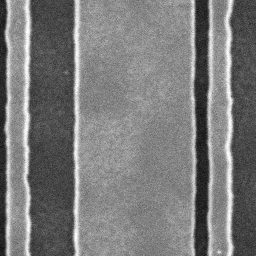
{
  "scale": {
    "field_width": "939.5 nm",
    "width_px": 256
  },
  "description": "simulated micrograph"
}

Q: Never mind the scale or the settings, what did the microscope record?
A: lines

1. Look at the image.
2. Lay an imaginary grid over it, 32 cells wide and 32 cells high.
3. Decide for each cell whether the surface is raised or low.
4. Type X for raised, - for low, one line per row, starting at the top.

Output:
-XX-------XXXXXXXXXXXXXX--XXX---
-XX-------XXXXXXXXXXXXXX--XXX---
-XX-------XXXXXXXXXXXXXX--XX----
-XX-------XXXXXXXXXXXXXX--XXX---
-XX-------XXXXXXXXXXXXXXX-XXX---
-XX-------XXXXXXXXXXXXXX--XXX---
-XX-------XXXXXXXXXXXXXX--XXX---
-XX-------XXXXXXXXXXXXXX--XXX---
-XX-------XXXXXXXXXXXXXX--XXX---
-XX-------XXXXXXXXXXXXXX--XXX---
-XX-------XXXXXXXXXXXXXX--XXX---
-XX-------XXXXXXXXXXXXXX--XXX---
-XX-------XXXXXXXXXXXXXX--XXX---
-XX-------XXXXXXXXXXXXXX--XXX---
-XX-------XXXXXXXXXXXXXX--XXX---
-XX-------XXXXXXXXXXXXXX--XXX---
-XX------XXXXXXXXXXXXXXX--XXX---
-XX-------XXXXXXXXXXXXXX--XXX---
-XX------XXXXXXXXXXXXXXX--XX----
-XX------XXXXXXXXXXXXXXXX-XXX---
-XX-------XXXXXXXXXXXXXXX-XXX---
-XX-------XXXXXXXXXXXXXX--XXX---
-XX-------XXXXXXXXXXXXXX--XXX---
-XX-------XXXXXXXXXXXXXX--XXX---
-XXX------XXXXXXXXXXXXXX--XXX---
-XX-------XXXXXXXXXXXXXX--XXX---
-XX------XXXXXXXXXXXXXXX--XXX---
-XXX------XXXXXXXXXXXXXX--XXX---
-XXX-----XXXXXXXXXXXXXXX--XXX---
-XX------XXXXXXXXXXXXXXX--XXX---
-XX------XXXXXXXXXXXXXXX--XXX---
-XX-------XXXXXXXXXXXXXX--XXX---